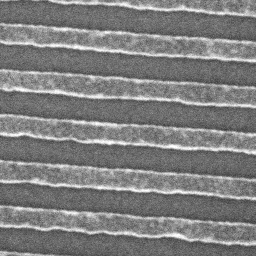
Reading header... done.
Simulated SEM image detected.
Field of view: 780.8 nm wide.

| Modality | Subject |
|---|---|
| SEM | lines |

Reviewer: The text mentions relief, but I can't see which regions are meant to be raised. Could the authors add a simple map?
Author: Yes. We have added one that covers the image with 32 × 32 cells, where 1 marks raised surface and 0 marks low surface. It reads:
00000000000001111111111111111111
00000000000000000000000001111111
00000000000000000000000000000000
11111110000000000000000000000000
11111111111111111111000000000000
00001111111111111111111111111111
00000000000000011111111111111111
00000000000000000000000000000001
00000000000000000000000000000000
11111111111000000000000000000000
11111111111111111111111110000000
00000010111111111111111111111111
00000000000000000000111111111111
00000000000000000000000000000000
11000000000000000000000000000000
11111111111101000000000000000000
11111111111111111111111111110000
00000000011111111111111111111111
00000000000000000000001111111111
00000000000000000000000000000000
11111100000000000000000000000000
11111111111111111110000000000000
11111111111111111111111111111111
00000000000001111111111111111111
00000000000000000000000000001111
00000000000000000000000000000000
11111111100000000000000000000000
11111111111111111111111000000000
00001111111111111111110111111111
00000000000000000111110111111111
00000000000000000000000000000011
00000000000000000000000000000000